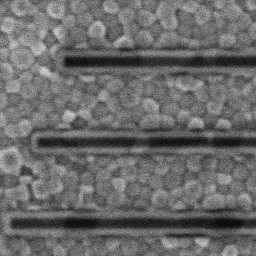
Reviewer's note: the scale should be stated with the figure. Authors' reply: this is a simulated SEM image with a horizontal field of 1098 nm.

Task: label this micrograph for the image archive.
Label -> one or a few lines or trenches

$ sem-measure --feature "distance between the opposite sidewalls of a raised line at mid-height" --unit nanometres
74.6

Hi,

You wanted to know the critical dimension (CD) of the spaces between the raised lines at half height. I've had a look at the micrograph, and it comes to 270 nm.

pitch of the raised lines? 345 nm